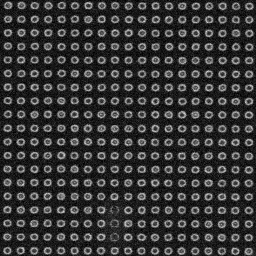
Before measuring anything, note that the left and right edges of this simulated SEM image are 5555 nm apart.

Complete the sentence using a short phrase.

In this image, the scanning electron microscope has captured a regular array of raised bodies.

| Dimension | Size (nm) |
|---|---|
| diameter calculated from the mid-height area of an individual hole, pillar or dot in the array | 141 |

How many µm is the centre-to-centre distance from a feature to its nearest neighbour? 0.287